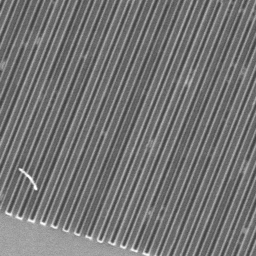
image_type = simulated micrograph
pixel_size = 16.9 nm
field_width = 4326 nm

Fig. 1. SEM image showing parallel lines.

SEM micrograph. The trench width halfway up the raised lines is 0.0962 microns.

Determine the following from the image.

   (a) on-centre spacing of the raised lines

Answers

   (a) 201 nanometers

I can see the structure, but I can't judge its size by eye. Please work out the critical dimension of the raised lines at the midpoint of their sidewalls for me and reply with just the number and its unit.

96.2 nanometres